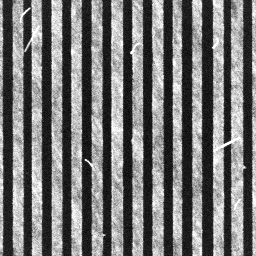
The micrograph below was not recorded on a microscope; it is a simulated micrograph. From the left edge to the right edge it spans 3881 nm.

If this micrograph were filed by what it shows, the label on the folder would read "parallel lines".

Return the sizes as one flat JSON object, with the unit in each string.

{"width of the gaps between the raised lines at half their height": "152 nanometers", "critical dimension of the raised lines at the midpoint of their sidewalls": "0.152 um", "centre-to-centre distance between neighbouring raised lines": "0.302 micrometres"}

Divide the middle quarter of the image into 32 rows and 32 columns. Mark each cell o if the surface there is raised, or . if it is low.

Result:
..oo...oo...ooo..ooo..ooo..oo...
..oo...oo...ooo..ooo..ooo..oo...
..oo...oo...ooo..ooo..ooo..oo...
..oo...oo...ooo..ooo..ooo..oo...
..oo...oo...ooo..ooo..ooo..oo...
..oo...oo...ooo..ooo..ooo..oo...
..oo...oo...ooo..ooo..ooo..oo...
..oo...oo...ooo..ooo..ooo..oo...
..oo...oo...ooo..ooo..ooo..oo...
..oo...oo...ooo..ooo..ooo..oo...
..oo...oo...ooo..ooo..ooo..oo...
..oo...oo...ooo..ooo..ooo..oo...
..oo...oo...ooo..ooo..ooo..oo...
..oo...oo...ooo..ooo..ooo..oo...
..oo...oo...ooo..ooo..ooo..oo...
..oo...oo...ooo..ooo..ooo..oo...
..oo...oo...ooo..ooo..ooo..oo...
..oo...oo...ooo..ooo..ooo..oo...
..oo...oo...ooo..ooo..ooo..oo...
..oo...oo...ooo..ooo..ooo..oo...
..oo...oo...ooo..ooo..ooo..oo...
..oo...oo...ooo..ooo..ooo..oo...
..oo...oo...ooo..ooo..ooo..oo...
..oo...oo...ooo..ooo..ooo..oo...
..oo...oo...ooo..ooo..ooo..oo...
..oo...oo...ooo..ooo..ooo..oo...
..oo...oo...oo...ooo..ooo..oo...
..oo...oo...oo...ooo..ooo..oo...
..oo...oo...oo...ooo..ooo..oo...
..oo...oo...oo...ooo..ooo..oo...
..oo...oo...ooo..ooo..ooo..oo...
..oo...oo...ooo..ooo..ooo..oo...